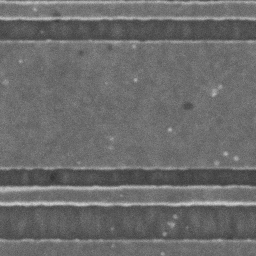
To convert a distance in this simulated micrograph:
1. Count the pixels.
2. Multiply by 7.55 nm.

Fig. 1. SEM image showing lines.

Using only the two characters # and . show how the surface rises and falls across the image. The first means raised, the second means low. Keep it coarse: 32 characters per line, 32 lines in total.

################################
################################
................................
................................
................................
################################
################################
################################
################################
################################
################################
################################
################################
################################
################################
################################
################################
################################
################################
################################
################################
................................
................................
......###..##.##################
################################
##.#.....##.############.....##.
................................
................................
................................
................................
################################
################################